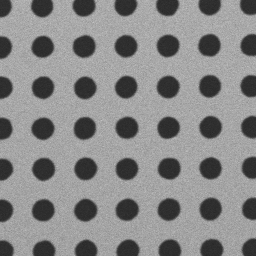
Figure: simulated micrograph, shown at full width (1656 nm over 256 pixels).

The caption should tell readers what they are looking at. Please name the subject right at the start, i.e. a regular array of holes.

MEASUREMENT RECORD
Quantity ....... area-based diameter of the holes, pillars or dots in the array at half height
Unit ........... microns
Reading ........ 0.144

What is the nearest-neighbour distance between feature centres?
264 nanometres